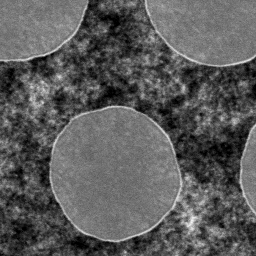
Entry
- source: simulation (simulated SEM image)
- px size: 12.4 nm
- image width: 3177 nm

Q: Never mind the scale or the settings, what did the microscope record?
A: raised bodies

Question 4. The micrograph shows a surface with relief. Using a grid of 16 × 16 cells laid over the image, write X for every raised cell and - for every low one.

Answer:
XXXXX----XXXXXXX
XXXXX-----XXXXXX
XXXX------XXXXXX
XX---------XXXXX
----------------
----------------
----------------
-----XXXX-------
----XXXXXX------
---XXXXXXXX----X
---XXXXXXXX----X
---XXXXXXXX----X
----XXXXXXX----X
----XXXXXX------
-----XXXX-------
----------------